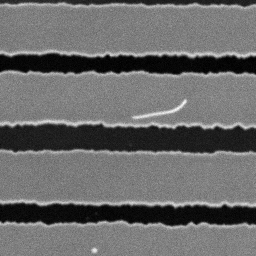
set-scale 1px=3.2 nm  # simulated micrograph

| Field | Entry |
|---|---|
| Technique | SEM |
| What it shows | lines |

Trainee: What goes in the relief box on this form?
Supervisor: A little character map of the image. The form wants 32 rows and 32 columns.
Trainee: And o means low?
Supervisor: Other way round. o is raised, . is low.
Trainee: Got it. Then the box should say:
o.ooooooo.....oo.o......o.......
oooooooooooooooooooooooooooooooo
oooooooooooooooooooooooooooooooo
oooooooooooooooooooooooooooooooo
oooooooooooooooooooooooooooooooo
oooooooooooooooooooooooooooooooo
oooooooooooooooooooooooooooooooo
................................
................................
oooooooooooooooooooooooooooooooo
oooooooooooooooooooooooooooooooo
oooooooooooooooooooooooooooooooo
oooooooooooooooooooooooooooooooo
oooooooooooooooooooooooooooooooo
oooooooooooooooooooooooooooooooo
ooooo...oooooooooooooooooooooooo
................................
................................
................................
oooooooooooooooooooooooooooooooo
oooooooooooooooooooooooooooooooo
oooooooooooooooooooooooooooooooo
oooooooooooooooooooooooooooooooo
oooooooooooooooooooooooooooooooo
oooooooooooooooooooooooooooooooo
o...ooo..ooooooooooooooooooooooo
................................
................................
oooooooooooooooooooooooooooooooo
oooooooooooooooooooooooooooooooo
oooooooooooooooooooooooooooooooo
oooooooooooooooooooooooooooooooo